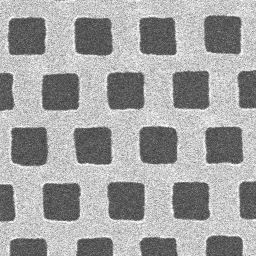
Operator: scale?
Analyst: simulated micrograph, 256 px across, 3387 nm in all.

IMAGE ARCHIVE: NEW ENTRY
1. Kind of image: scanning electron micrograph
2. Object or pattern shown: a regular array of holes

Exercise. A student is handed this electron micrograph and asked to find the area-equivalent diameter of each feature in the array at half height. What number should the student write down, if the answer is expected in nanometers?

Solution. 552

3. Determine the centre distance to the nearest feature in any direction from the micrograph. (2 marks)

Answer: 837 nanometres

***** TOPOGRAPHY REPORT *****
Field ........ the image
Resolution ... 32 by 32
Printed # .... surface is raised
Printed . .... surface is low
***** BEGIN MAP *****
################################
################################
#.....####....####....####....##
#.....###.....###.....###.....##
#.....###.....###.....####....##
#.....###.....###.....####....##
#....#####....####....####....##
################################
################################
..####....###.....####....####..
..###.....###.....###.....####..
.####.....###.....####....####..
..###.....###.....####....####..
..###.....####....####....####..
################################
################################
#.....###.....###.....####....##
#.....###.....###.....####....##
#.....###.....###.....####....##
#.....###.....####....####....##
##....#####...#####..#####.##.##
################################
################################
..###.....###.....####....####..
..###.....###.....###.....####..
..###.....###.....####....####..
..###.....####....####....####..
..#####..#####....######..######
################################
##########################...###
#.....####....###.....####....##
#.....####....####....####....##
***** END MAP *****